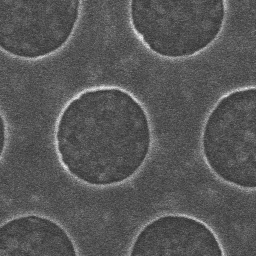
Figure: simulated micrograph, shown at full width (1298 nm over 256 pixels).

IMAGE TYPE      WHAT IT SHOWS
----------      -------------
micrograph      holes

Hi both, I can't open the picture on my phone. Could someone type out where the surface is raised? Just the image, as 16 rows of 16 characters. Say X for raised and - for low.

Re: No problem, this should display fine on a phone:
-----XXX------XX
-----XXX------XX
----XXXXX----XXX
X-XXXXXXXX--XXXX
XXXXXXXXXXXXXXXX
XXXXXXXXXXXXXXXX
XXXX-----XXXXX--
XXXX-----XXXX---
XXXX-----XXXX---
XXXX-----XXXX---
XXXX-----XXXX---
XXXXXX-XXXXXXXX-
XXXXXXXXXXXXXXXX
XXXXXXXXXXXXXXXX
----XXXXX----XXX
-----XXX------XX